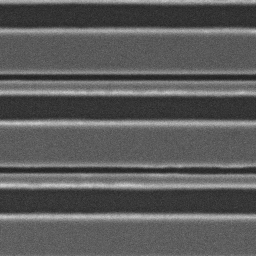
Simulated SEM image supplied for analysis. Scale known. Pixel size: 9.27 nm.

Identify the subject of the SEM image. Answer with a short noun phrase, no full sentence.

lines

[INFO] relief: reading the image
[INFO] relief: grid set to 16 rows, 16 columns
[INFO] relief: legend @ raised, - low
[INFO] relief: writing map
----------------
----------------
@@@@@@@@@@@@@@@@
@@@@@@@@@@@@@@@@
@@@@@@@@@@@@@@@@
@@@@@@@@@@@@@@@@
----------------
----------------
@@@@@@@@@@@@@@@@
@@@@@@@@@@@@@@@@
@@@@@@@@@@@@@@@@
@@@@@@@@@@@@@@@@
----------------
----------------
@@@@@@@@@@@@@@@@
@@@@@@@@@@@@@@@@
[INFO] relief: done